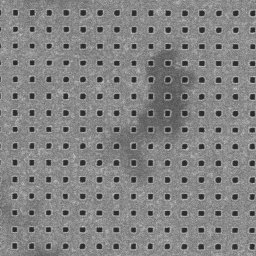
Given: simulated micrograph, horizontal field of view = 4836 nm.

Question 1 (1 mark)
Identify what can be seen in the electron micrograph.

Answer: a regular array of holes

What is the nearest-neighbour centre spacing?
0.312 µm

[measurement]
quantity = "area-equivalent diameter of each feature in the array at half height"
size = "117 nm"